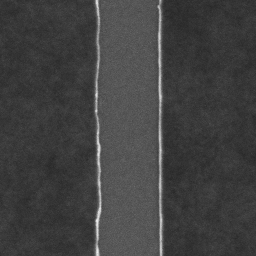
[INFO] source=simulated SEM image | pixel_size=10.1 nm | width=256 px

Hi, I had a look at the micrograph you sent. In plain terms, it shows one or a few lines or trenches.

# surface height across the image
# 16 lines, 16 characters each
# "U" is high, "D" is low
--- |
UUUUUUDDDDUUUUUU
UUUUUUDDDDUUUUUU
UUUUUUDDDDUUUUUU
UUUUUUDDDDUUUUUU
UUUUUUDDDDUUUUUU
UUUUUUDDDDUUUUUU
UUUUUUDDDDUUUUUU
UUUUUUDDDDUUUUUU
UUUUUUDDDDUUUUUU
UUUUUUDDDDUUUUUU
UUUUUUDDDDUUUUUU
UUUUUUDDDDUUUUUU
UUUUUUDDDDUUUUUU
UUUUUUDDDDUUUUUU
UUUUUUDDDDUUUUUU
UUUUUUDDDDUUUUUU